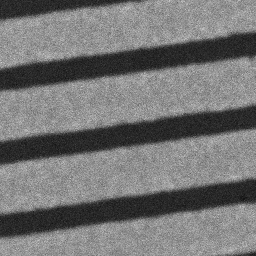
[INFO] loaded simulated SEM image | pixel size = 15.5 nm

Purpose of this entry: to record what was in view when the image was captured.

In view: one or a few lines or trenches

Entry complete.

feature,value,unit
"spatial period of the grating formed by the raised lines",1120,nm